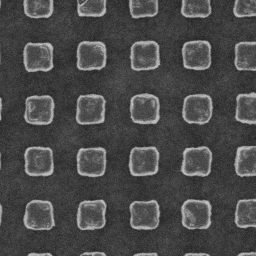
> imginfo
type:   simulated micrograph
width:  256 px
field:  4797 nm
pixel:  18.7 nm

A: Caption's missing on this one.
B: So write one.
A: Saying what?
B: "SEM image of a regular array of raised bodies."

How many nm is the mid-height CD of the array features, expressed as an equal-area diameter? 563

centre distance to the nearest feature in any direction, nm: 974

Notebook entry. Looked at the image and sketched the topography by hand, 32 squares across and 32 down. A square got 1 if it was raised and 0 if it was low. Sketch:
00011100001110001111000111000111
00011100001110001111000111000111
00000000000000000000000000000000
00000000000000000000000000000000
00000000000000000000000000000000
00000000001110000110000111000011
00011100001110001111000111000111
00011100001110001111000111000111
00011100001100000110000111000011
00000000000000000000000000000000
00000000000000000000000000000000
00000000000000000000000000000000
00011100001110001111000111000011
00011110001110001111000111000011
00011110001110001111000111000011
00000000000000000000000000000000
00000000000000000000000000000000
00000000000000000000000000000000
00000100000000000000000001000001
00011110001110001111000111000011
00011110001110001111000111000011
00011100001110000110000111000011
00000000000000000000000000000000
00000000000000000000000000000000
00000000000000000000000000000000
00001100001110000111000111000011
00011100001110001111000111000011
00011110001110001111000111000011
00001100001000000110000010000000
00000000000000000000000000000000
00000000000000000000000000000000
00000000000000000000000000000000